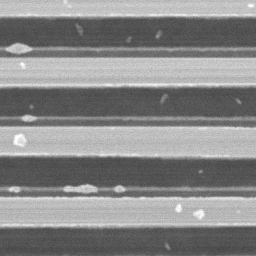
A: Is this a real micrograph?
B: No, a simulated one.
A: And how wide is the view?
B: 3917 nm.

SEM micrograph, lines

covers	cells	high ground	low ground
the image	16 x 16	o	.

oooooooooooooooo
................
................
oooooooooooooooo
oooooooooooooooo
................
................
ooooooooo...o...
oooooooooooooooo
oooooooooooooooo
................
................
oooooooooooooooo
oooooooooooooooo
................
................